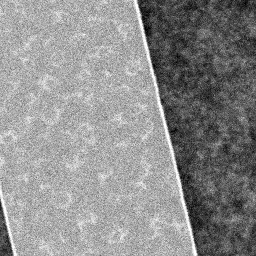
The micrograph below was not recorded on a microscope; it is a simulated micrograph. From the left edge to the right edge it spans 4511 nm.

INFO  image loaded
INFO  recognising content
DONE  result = one or a few lines or trenches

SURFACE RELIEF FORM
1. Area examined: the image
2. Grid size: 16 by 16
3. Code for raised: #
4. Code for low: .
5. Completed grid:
#########.......
#########.......
#########.......
#########.......
##########......
##########......
##########......
##########......
###########.....
###########.....
###########.....
###########.....
###########.....
############....
.###########....
.###########....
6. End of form